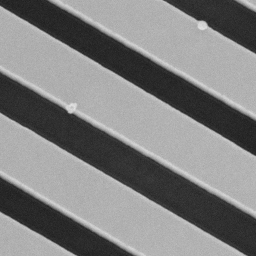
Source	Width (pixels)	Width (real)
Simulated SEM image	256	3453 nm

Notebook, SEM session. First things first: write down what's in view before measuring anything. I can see lines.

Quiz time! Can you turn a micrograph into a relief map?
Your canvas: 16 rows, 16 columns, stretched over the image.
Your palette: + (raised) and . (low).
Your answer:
....+++++++.....
++....+++++++...
++++...+++++++..
+++++....+++++++
+++++++....+++++
..+++++++....+++
....++++++....++
+....+++++++....
+++....+++++++..
++++.....+++++++
++++++.....+++++
.+++++++....++++
...++++++.....++
....+++++++.....
++....+++++++...
++++....+++++++.